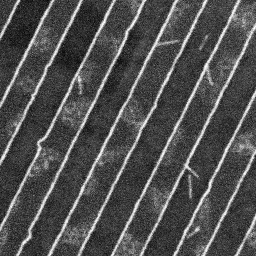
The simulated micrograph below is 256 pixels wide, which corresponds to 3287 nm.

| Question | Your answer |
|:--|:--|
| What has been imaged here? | parallel lines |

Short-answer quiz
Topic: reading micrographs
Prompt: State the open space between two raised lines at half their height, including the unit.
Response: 369 nm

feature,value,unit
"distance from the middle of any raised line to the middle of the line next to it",0.715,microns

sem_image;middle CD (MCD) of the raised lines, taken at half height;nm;345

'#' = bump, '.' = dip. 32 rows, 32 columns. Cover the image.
##....####....####....####....##
##....###.....###....####....###
#....####....####....####....###
#....###.....###....####....####
....####....####....####....###.
....###.....###....####....####.
...####....####....####....###..
...####....###....####....####..
..####....####....####....###...
..###....####....####....####...
.####....####....####....###....
.###.....###....####....####....
####....####....####....###....#
###.....###....####....####....#
###....####....####....###....##
###....###....####....####....##
##....####....####....###....###
#....####....####....####....###
#....####....####....###....####
.....###....####....####....####
....####....####....####...####.
....###....####....####....####.
...####....####....###....####..
...###....####....####....####..
..####....####....###.....###...
..###....####....####....####...
.####....####....###....####....
.###....####....####....####....
####....####....###....####....#
####...####....####....####....#
###....####....###....####....##
##....####....####....####....##